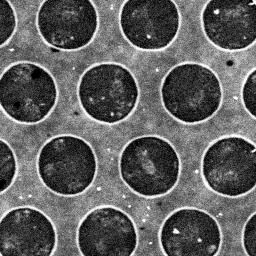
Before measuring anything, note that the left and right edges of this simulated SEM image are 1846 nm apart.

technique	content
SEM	holes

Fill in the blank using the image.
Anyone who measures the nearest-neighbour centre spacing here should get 598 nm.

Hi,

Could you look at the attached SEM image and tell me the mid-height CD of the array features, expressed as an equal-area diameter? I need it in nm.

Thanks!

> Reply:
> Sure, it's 430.